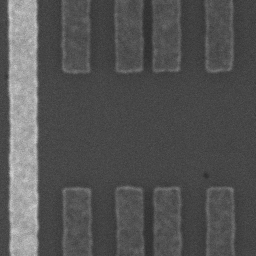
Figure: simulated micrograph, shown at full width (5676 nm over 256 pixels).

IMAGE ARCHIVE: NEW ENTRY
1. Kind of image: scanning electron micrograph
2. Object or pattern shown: wiring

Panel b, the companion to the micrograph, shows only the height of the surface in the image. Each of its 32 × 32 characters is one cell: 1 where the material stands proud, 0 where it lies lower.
01110000111000111101110000111000
01110000111000111101110000111000
01110000111000111101110000111000
01111000111000111101110000111000
01111000111000111101110000111000
01111000111000111101110000111000
01110000111000011101110000111000
01110000111000011101110000111000
01110000111000011101110000111000
01110000000000000000000000000000
01111000000000000000000000000000
01110000000000000000000000000000
01111000000000000000000000000000
01110000000000000000000000000000
01110000000000000000000000000000
01111000000000000000000000000000
01111000000000000000000000000000
01111000000000000000000000000000
01110000000000000000000000000000
01110000000000000000000000000000
01111000000000000000000000000000
01111000000000000000000000000000
01111000000000000000000000000000
01111000000000011000000000000000
01111000111000011101110000111000
01111000111000011101110000111000
01111000111000011101110000111000
01111000111000011101110000111000
01111000111000011101110000111000
01111000111000011101111000111000
01111000111000011101111000111000
01111000111000011101110000111000